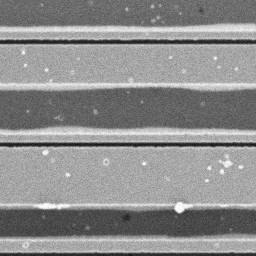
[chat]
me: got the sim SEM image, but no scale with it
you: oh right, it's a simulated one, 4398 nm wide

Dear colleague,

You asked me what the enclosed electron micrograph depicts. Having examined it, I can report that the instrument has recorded lines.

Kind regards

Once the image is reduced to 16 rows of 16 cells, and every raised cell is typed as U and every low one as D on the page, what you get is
DDDDDDDDDDDDDDDD
DDDDDDDDDDDDDDDD
UUUUUUUUUUUUUUUU
UUUUUUUUUUUUUUUU
UUUUUUUUUUUUUUUU
DDDDDDDDDDDDDDDD
DDDDDDDDDDDDDDDD
DDDDDDDDDDDDDDDD
UUUUUUUUUUUUUUUU
UUUUUUUUUUUUUUUU
UUUUUUUUUUUUUUUU
UUUUUUUUUUUUUUUU
UUUUUUUUUUUUUUUU
DDDDDDDDDDDDDDDD
DDDDDDDDDDDDDDDD
UUUUUUUUUUUUUUUU